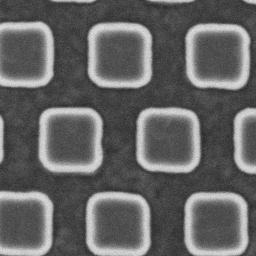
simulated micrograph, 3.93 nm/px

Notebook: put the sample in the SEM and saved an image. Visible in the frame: raised bodies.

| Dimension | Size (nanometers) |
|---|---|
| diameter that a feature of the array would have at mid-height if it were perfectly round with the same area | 256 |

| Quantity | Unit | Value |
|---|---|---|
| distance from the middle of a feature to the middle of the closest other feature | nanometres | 381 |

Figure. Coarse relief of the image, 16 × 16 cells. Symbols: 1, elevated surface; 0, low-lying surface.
0000000000000000
0000000000000000
1110001110001110
1110001110001110
1110001110001110
0000000000000000
0000000000000000
0001110001110001
0001110001110001
0001110001110001
0001110001110001
0000000000000000
1110001110001110
1110001110001110
1110001110001110
1110001110001110